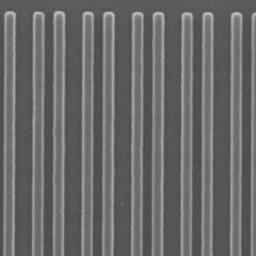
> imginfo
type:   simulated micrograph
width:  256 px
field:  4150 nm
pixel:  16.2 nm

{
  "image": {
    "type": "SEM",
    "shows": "parallel lines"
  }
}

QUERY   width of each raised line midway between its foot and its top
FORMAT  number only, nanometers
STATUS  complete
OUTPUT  154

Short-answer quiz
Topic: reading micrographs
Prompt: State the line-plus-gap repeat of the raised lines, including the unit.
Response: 408 nanometers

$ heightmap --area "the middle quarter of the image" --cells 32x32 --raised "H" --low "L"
LLLLLHHLLLHHLLLLLHHHLLHHHLLLLLHH
LLLLLHHLLLHHLLLLLHHHLLHHHLLLLLHH
LLLLLHHLLLHHLLLLLHHHLLHHHLLLLLHH
LLLLLHHLLLHHLLLLLHHLLLHHHLLLLLHH
LLLLLHHLLLHHLLLLLHHLLLHHHLLLLLHH
LLLLLHHLLLHHLLLLLHHLLLHHHLLLLLHH
LLLLLHHLLLHHLLLLLHHHLLHHHLLLLLHH
LLLLLHHLLLHHLLLLLHHHLLHHHLLLLLHH
LLLLLHHLLLHHLLLLLHHHLLHHHLLLLLHH
LLLLLHHLLLHHLLLLLHHHLLHHHLLLLLHH
LLLLLHHLLLHHLLLLLHHLLLHHHLLLLLHH
LLLLLHHLLLHHLLLLLHHHLLHHHLLLLLHH
LLLLLHHLLLHHLLLLLHHHLLHHHLLLLLHH
LLLLLHHLLLHHLLLLLHHHLLHHHLLLLLHH
LLLLLHHLLLHHLLLLLHHHLLHHHLLLLLHH
LLLLLHHLLLHHLLLLLHHHLLHHHLLLLLHH
LLLLLHHLLLHHLLLLLHHHLLHHHLLLLLHH
LLLLLHHLLLHHLLLLLHHLLLHHHLLLLLHH
LLLLLHHLLLHHLLLLLHHLLLHHLLLLLLHH
LLLLLHHLLLHHLLLLLHHHLLHHLLLLLLHH
LLLLLHHLLLHHLLLLLHHHLLHHHLLLLLHH
LLLLLHHLLLHHLLLLLHHLLLHHHLLLLLHH
LLLLLHHLLLHHLLLLLHHLLLHHLLLLLLHH
LLLLLHHLLLHHLLLLLHHLLLHHLLLLLHHH
LLLLLHHLLLHHLLLLLHHLLLHHHLLLLHHH
LLLLLHHLLLHHLLLLLHHLLLHHHLLLLHHH
LLLLLHHLLLHHLLLLLHHLLLHHHLLLLHHH
LLLLLHHLLLHHLLLLLHHHLLHHHLLLLHHH
LLLLLHHLLLHHLLLLLHHHLLHHHLLLLHHH
LLLLLHHLLLHHLLLLLHHLLLHHHLLLLHHH
LLLLLHHLLLHHLLLLLHHLLLHHLLLLLHHH
LLLLLHHLLLHHLLLLLHHLLLHHLLLLLLHH